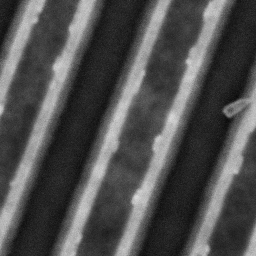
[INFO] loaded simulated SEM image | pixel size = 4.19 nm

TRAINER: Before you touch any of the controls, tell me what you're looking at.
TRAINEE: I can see one or a few lines or trenches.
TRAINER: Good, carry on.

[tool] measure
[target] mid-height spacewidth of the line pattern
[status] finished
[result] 291 nm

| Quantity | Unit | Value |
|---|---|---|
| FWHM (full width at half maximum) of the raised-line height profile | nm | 217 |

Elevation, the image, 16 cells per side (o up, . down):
..ooo.....oooo..
..ooo.....ooo...
.oooo....oooo...
.ooo.....ooo....
.ooo.....ooo....
ooo.....oooo....
ooo.....ooo.....
ooo....oooo....o
oo.....ooo.....o
oo.....ooo.....o
oo....oooo....oo
o.....ooo.....oo
o....oooo.....oo
.....oooo....ooo
.....ooo.....ooo
....oooo....oooo